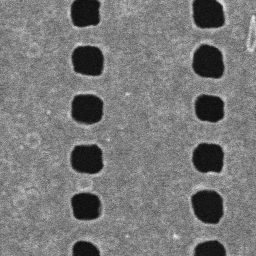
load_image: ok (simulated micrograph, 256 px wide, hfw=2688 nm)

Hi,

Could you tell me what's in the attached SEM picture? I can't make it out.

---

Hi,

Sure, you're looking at a regular array of holes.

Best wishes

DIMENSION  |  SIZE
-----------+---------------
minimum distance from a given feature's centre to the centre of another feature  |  48 pixels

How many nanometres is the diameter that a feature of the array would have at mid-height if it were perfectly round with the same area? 341